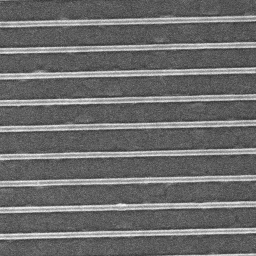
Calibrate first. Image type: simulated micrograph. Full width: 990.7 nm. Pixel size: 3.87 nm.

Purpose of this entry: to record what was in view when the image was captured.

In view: parallel lines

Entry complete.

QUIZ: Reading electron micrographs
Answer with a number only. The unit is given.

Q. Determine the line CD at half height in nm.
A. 18.4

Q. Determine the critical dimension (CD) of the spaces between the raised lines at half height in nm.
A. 82.4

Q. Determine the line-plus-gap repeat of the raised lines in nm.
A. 102